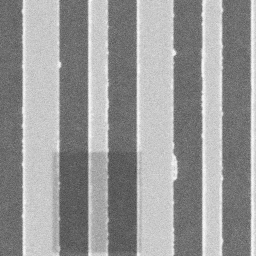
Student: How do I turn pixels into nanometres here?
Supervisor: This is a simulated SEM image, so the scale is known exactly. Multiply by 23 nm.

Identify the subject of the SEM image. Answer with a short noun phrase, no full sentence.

lines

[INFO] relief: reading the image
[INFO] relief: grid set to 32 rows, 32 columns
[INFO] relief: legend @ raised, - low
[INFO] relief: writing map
---@@@@----@@----@@@@@---@@@---@
---@@@@----@@----@@@@@---@@@---@
---@@@@----@@----@@@@@---@@@---@
---@@@@----@@----@@@@@---@@@----
---@@@@----@@----@@@@@---@@@----
---@@@@----@@----@@@@@---@@@---@
---@@@@----@@----@@@@@---@@@---@
---@@@@----@@----@@@@@---@@@---@
---@@@@----@@----@@@@@---@@@----
---@@@@----@@----@@@@@---@@@---@
---@@@@----@@----@@@@@---@@@----
---@@@@----@@----@@@@@---@@@----
---@@@@----@@----@@@@@---@@@----
---@@@@----@@----@@@@@---@@@---@
---@@@@----@@----@@@@@---@@@---@
---@@@@----@@----@@@@@---@@@----
---@@@@----@@----@@@@@---@@@----
---@@@@----@@----@@@@@---@@@----
---@@@@----@@----@@@@@---@@@---@
---@@@@----@@----@@@@@---@@@---@
---@@@@----@@----@@@@@---@@@---@
---@@@@----@@----@@@@@---@@@---@
---@@@@----@@----@@@@@---@@@---@
---@@@@----@@----@@@@@---@@@---@
---@@@@----@@----@@@@@---@@@----
---@@@@----@@----@@@@@---@@@---@
---@@@@----@@----@@@@@---@@@----
---@@@@----@@----@@@@@---@@@----
---@@@@----@@----@@@@@---@@@---@
---@@@@----@@----@@@@@---@@@---@
---@@@@----@@----@@@@@---@@@---@
---@@@@----@@----@@@@@---@@@----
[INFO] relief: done